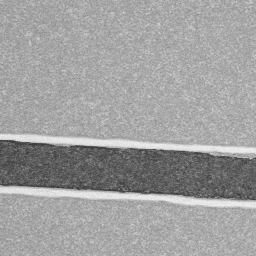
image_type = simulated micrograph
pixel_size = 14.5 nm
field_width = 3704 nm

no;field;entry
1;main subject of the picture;one or a few lines or trenches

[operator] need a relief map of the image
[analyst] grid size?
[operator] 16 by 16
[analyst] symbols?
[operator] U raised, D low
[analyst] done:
UUUUUUUUUUUUUUUU
UUUUUUUUUUUUUUUU
UUUUUUUUUUUUUUUU
UUUUUUUUUUUUUUUU
UUUUUUUUUUUUUUUU
UUUUUUUUUUUUUUUU
UUUUUUUUUUUUUUUU
UUUUUUUUUUUUUUUU
UUUUUUUUUUUUUUUU
DDDDDDDDDDDDDDDD
DDDDDDDDDDDDDDDD
DDDDDDDDDDDDDDDD
UUUUUUUUUUUDDDDD
UUUUUUUUUUUUUUUU
UUUUUUUUUUUUUUUU
UUUUUUUUUUUUUUUU